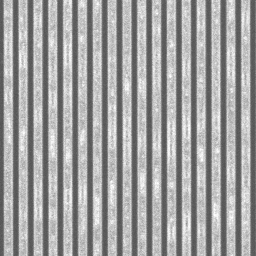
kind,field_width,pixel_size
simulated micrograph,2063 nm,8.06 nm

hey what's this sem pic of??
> parallel lines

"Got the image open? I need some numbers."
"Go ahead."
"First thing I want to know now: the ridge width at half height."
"75.6 nanometers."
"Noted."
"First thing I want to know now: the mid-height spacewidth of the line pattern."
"41.3 nm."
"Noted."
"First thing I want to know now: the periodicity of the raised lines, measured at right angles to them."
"120 nm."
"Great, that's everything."